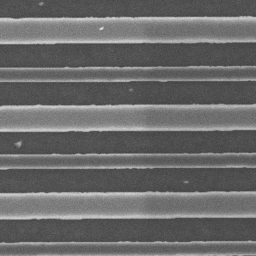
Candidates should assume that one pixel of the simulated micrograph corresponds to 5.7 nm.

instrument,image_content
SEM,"lines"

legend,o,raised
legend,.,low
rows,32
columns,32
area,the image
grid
................................
................................
oooooooooooooooooooooooooooooooo
oooooooooooooooooooooooooooooooo
oooooooooooooooooooooooooooooooo
................................
................................
................................
........o.oooooooooooooooooooooo
oooooooooooooooooooooooooooooooo
................................
................................
................................
oooooooooooooooooooooooooooooooo
oooooooooooooooooooooooooooooooo
oooooooooooooooooooooooooooooooo
................................
................................
................................
oooooooooooooooooooooooooooooooo
oooooooooooooooooooooooooooooooo
................................
................................
................................
oooooooooooooooooooooooooooooooo
oooooooooooooooooooooooooooooooo
oooooooooooooooooooooooooooooooo
................................
................................
................................
oooooooooooooooooooooooooooooooo
oooooooooooooooooooooooooooooooo